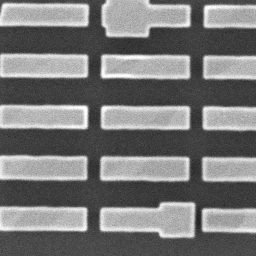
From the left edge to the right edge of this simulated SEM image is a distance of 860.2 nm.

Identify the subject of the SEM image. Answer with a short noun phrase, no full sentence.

wiring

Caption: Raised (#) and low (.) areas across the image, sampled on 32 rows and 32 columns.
.............######.............
###########..###########..######
###########..###########..######
.............######.............
..............####..............
................................
................................
###########..###########..######
###########..###########..######
###########..###########..######
................................
................................
................................
###########..##########...######
###########..###########.#######
###########..###########.#######
................................
................................
................................
####............................
###########..###########.#######
###########..###########.#######
.......##....##########...######
................................
................................
....................####........
###########..###########.#######
###########..###########.#######
###########..###########.#######
....................####........
................................
................................